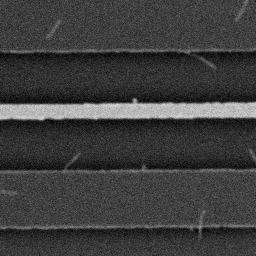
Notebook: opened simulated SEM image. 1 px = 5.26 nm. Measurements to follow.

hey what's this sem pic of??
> lines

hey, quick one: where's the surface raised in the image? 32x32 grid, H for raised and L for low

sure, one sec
HHHHHHHHHHHHHHHHHHHHHHHHHHHHHHHH
HHHHHHHHHHHHHHHHHHHHHHHHHHHHHHHH
HHHHHHHHHHHHHHHHHHHHHHHHHHHHHHHH
HHHHHHHHHHHHHHHHHHHHHHHHHHHHHHHH
HHHHHHHHHHHHHHHHHHHHHHHHHHHHHHHH
HHHHHHHHHHHHHHHHHHHHHHHHHHHHHHHH
LHHHHLLHHLLLLLLLLLLLLLLHLLLLLLLL
LLLLLLLLLLLLLLLLLLLLLLLLLLLLLLLL
LLLLLLLLLLLLLLLLLLLLLLLLLLLLLLLL
LLLLLLLLLLLLLLLLLLLLLLLLLLLLLLLL
LLLLLLLLLLLLLLLLLLLLLLLLLLLLLLLL
LLLLLLLLLLLLLLLLLLLLLLLLLLLLLLLL
LLLLLLLLLLLLLLLLLLLLLLLLLLLLLLLL
HHHHHHHHHHHHHHHHHHHHHHHHHHHHHHHH
HHHHHHHHHHHHHHHHHHHHHHHHHHHHHHHH
LLLLLLLLLLLLLLLLLLLLLLLLLLLLLLLL
LLLLLLLLLLLLLLLLLLLLLLLLLLLLLLLL
LLLLLLLLLLLLLLLLLLLLLLLLLLLLLLLL
LLLLLLLLLLLLLLLLLLLLLLLLLLLLLLLL
LLLLLLLLLLLLLLLLLLLLLLLLLLLLLLLL
LLLLLLLLLLLLLLLLLLLLLLLLLLLLLLLL
HHHHHHHHHHHHHHHHHHHHHHHHHHHHHHHH
HHHHHHHHHHHHHHHHHHHHHHHHHHHHHHHH
HHHHHHHHHHHHHHHHHHHHHHHHHHHHHHHH
HHHHHHHHHHHHHHHHHHHHHHHHHHHHHHHH
HHHHHHHHHHHHHHHHHHHHHHHHHHHHHHHH
HHHHHHHHHHHHHHHHHHHHHHHHHHHHHHHH
HHHHHHHHHHHHHHHHHHHHHHHHHHHHHHHH
HLHHHHHLLLLLLLLLLLLLLLLLLLLLLLLL
LLLLLLLLLLLLLLLLLLLLLLLLLLLLLLLL
LLLLLLLLLLLLLLLLLLLLLLLLLLLLLLLL
LLLLLLLLLLLLLLLLLLLLLLLLLLLLLLLL